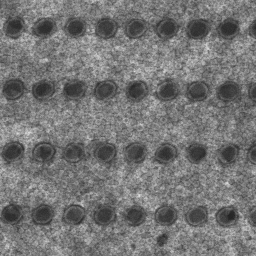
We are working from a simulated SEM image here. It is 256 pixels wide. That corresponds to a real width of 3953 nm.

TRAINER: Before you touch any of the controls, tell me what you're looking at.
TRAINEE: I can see a regular array of raised bodies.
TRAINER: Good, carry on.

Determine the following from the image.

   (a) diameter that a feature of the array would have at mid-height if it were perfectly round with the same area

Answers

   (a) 18 pixels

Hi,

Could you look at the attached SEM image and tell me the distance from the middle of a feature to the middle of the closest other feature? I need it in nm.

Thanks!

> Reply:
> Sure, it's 472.